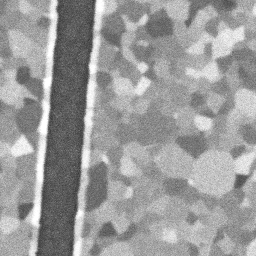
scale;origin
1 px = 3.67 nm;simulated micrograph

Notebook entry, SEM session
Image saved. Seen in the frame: one or a few lines or trenches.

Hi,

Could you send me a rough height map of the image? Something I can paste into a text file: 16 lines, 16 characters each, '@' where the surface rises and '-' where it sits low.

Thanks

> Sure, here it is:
@@@---@@@@@@@@@@
@@@---@@@@@@@@@@
@@@---@@@@@@@@@@
@@@---@@@@@@@@@@
@@@---@@@@@@@@@@
@@@---@@@@@@@@@@
@@@---@@@@@@@@@@
@@@---@@@@@@@@@@
@@@--@@@@@@@@@@@
@@@--@@@@@@@@@@@
@@@--@@@@@@@@@@@
@@---@@@@@@@@@@@
@@---@@@@@@@@@@@
@@---@@@@@@@@@@@
@@---@@@@@@@@@@@
@@---@@@@@@@@@@@